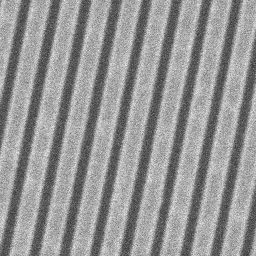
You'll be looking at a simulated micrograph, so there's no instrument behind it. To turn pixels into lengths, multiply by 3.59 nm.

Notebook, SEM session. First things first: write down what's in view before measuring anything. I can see parallel lines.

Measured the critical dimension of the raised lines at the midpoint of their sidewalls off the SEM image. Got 0.0616 micrometres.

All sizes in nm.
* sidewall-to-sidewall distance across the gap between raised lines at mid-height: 46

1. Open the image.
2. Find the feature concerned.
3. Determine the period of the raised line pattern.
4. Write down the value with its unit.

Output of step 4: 29.6 pixels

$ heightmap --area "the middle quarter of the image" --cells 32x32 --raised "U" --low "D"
UDDDUUUUDDDUUUUUDDDUUUUDDDDUUUUD
DDDDUUUUDDDUUUUUDDDUUUUDDDUUUUUD
DDDUUUUUDDDUUUUDDDUUUUUDDDUUUUDD
DDDUUUUDDDDUUUUDDDUUUUUDDDUUUUDD
DDDUUUUDDDDUUUUDDDUUUUDDDDUUUUDD
DDDUUUUDDDUUUUUDDDUUUUDDDDUUUUDD
DDDUUUUDDDUUUUDDDDUUUUDDDUUUUUDD
DDUUUUUDDDUUUUDDDUUUUUDDDUUUUDDD
DDUUUUDDDDUUUUDDDUUUUUDDDUUUUDDD
DDUUUUDDDDUUUUDDDUUUUDDDDUUUUDDD
DDUUUUDDDUUUUUDDDUUUUDDDUUUUUDDD
DDUUUUDDDUUUUDDDDUUUUDDDUUUUUDDD
DUUUUUDDDUUUUDDDUUUUUDDDUUUUDDDD
DUUUUDDDDUUUUDDDUUUUDDDDUUUUDDDU
DUUUUDDDDUUUUDDDUUUUDDDDUUUUDDDU
DUUUUDDDUUUUUDDDUUUUDDDUUUUUDDDU
DUUUUDDDUUUUDDDDUUUUDDDUUUUUDDDU
UUUUUDDDUUUUDDDUUUUUDDDUUUUDDDUU
UUUUDDDDUUUUDDDUUUUDDDDUUUUDDDUU
UUUUDDDDUUUUDDDUUUUDDDDUUUUDDDUU
UUUUDDDUUUUUDDDUUUUDDDUUUUUDDDUU
UUUUDDDUUUUDDDDUUUUDDDUUUUUDDDUU
UUUUDDDUUUUDDDUUUUUDDDUUUUDDDUUU
UUUDDDDUUUUDDDUUUUDDDDUUUUDDDUUU
UUUDDDDUUUUDDDUUUUDDDDUUUUDDDUUU
UUUDDDUUUUUDDDUUUUDDDUUUUUDDDUUU
UUUDDDUUUUDDDDUUUUDDDUUUUDDDDUUU
UUUDDDUUUUDDDUUUUUDDDUUUUDDDDUUU
UUDDDDUUUUDDDUUUUDDDDUUUUDDDUUUU
UUDDDDUUUUDDDUUUUDDDDUUUUDDDUUUU
UUDDDUUUUUDDDUUUUDDDUUUUUDDDUUUU
UUDDDUUUUDDDDUUUUDDDUUUUDDDDUUUU